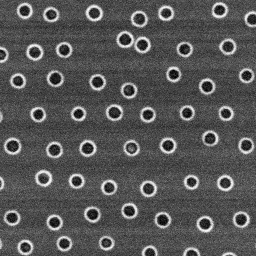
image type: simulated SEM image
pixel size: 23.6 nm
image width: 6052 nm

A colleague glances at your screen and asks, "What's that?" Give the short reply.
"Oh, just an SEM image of a regular array of holes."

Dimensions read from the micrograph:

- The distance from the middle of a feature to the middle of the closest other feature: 745 nanometers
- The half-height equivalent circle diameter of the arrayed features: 12.7 pixels